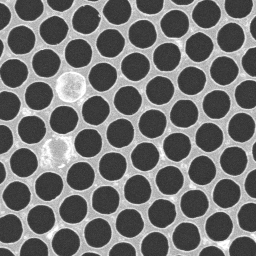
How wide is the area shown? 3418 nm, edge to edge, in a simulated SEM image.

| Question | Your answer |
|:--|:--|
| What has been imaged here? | a regular array of holes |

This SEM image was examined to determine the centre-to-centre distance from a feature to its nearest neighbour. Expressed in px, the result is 33.4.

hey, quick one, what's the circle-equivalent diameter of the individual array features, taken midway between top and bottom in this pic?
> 384 nm